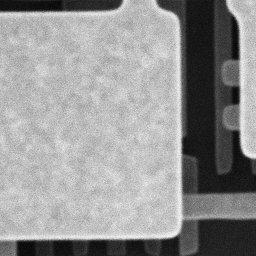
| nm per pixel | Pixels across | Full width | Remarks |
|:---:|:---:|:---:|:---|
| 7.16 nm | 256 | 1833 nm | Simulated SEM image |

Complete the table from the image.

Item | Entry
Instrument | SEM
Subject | wiring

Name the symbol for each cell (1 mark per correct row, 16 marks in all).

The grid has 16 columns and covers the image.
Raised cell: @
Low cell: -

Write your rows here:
-------@@@----@@
@@@@@@@@@@@----@
@@@@@@@@@@@----@
@@@@@@@@@@@----@
@@@@@@@@@@@---@@
@@@@@@@@@@@----@
@@@@@@@@@@@----@
@@@@@@@@@@@---@@
@@@@@@@@@@@----@
@@@@@@@@@@@----@
@@@@@@@@@@@-----
@@@@@@@@@@@-----
@@@@@@@@@@@@@@@@
@@@@@@@@@@@@@@@@
@@@@@@@@@@@-----
@---------------